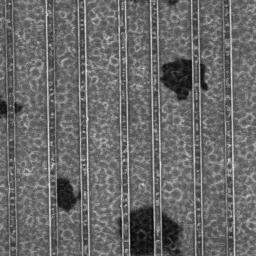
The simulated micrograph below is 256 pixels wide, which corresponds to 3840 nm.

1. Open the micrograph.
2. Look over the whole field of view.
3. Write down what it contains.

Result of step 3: parallel lines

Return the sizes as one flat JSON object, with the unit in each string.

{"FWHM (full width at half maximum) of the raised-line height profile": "107 nanometers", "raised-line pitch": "544 nanometres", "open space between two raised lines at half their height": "435 nanometers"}